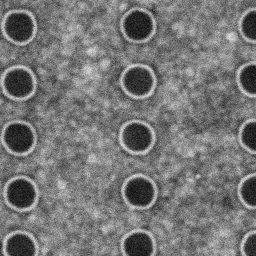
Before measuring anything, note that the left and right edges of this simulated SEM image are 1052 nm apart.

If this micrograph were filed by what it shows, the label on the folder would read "a regular array of raised bodies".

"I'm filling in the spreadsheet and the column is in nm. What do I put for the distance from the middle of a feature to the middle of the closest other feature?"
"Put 227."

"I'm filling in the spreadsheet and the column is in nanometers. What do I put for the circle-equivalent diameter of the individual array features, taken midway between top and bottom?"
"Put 138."